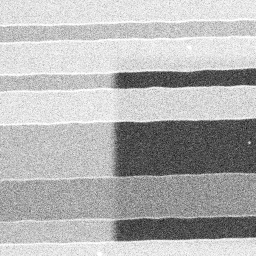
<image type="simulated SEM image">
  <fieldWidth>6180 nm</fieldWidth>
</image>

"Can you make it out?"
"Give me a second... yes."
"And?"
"groups of lines, slits or small figures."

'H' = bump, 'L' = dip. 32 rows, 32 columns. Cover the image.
HHHHHHHHHHHHHHHHHHHHHHHHHHHHHHHH
HHHHHHHHHHHHHHHHHHHHHHHHHHHHHHHH
HHHHHHHHHHHHHHHHHHHHHHHHHHHHHHLL
LLLLLLLLLLLLLLLLLLLLLLLLLLLLLLLL
LLLLLLLLLLLLLLLLLLLLLLLLLLLLLLLL
HHHHHHHHHHHHHHHHHHHHHHHHHHHHHHHH
HHHHHHHHHHHHHHHHHHHHHHHHHHHHHHHH
HHHHHHHHHHHHHHHHHHHHHHHHHHHHHHHH
HHHHHHHHHHHHHHHHHHHHHHHHHHHHHHHL
LLLLLLLLLLLLLLLLLLLLLLLLLLLLLLLL
LLLLLLLLLLLLLLLLLLLLLLLLLLLLLLLL
LHHHLHHHHHHHHHHHHHHHHHHHHHHHHHHH
HHHHHHHHHHHHHHHHHHHHHHHHHHHHHHHH
HHHHHHHHHHHHHHHHHHHHHHHHHHHHHHHH
HHHHHHHHHHHHHHHHHHHHHHHHHHHHHHHH
LLLLLLLLLLLLLLLLLLLLLLLLLLLLLLLL
LLLLLLLLLLLLLLLLLLLLLLLLLLLLLLLL
LLLLLLLLLLLLLLLLLLLLLLLLLLLLLLLL
LLLLLLLLLLLLLLLLLLLLLLLLLLLLLLLL
LLLLLLLLLLLLLLLLLLLLLLLLLLLLLLLL
LLLLLLLLLLLLLLLLLLLLLLLLLLLLLLLL
LLLLLLLLLLLLLLLLLLLLLLLLLLLLLLLL
LLLHHHHHHHHHHHHHHHHHHHHHHHHHHHHH
HHHHHHHHHHHHHHHHHHHHHHHHHHHHHHHH
HHHHHHHHHHHHHHHHHHHHHHHHHHHHHHHH
HHHHHHHHHHHHHHHHHHHHHHHHHHHHHHHH
HHHHHHHHHHHHHHHHHHHHHHHHHHHHHHHH
HHHHHHHHLLLLLLLLLLLLLLLLLLLLLLLL
LLLLLLLLLLLLLLLLLLLLLLLLLLLLLLLL
LLLLLLLLLLLLLLLLLLLLLLLLLLLLLLLL
LLLLHHHLHHHHHHHHHHHHHHHHHHHHHHHH
HHHHHHHHHHHHHHHHHHHHHHHHHHHHHHHH